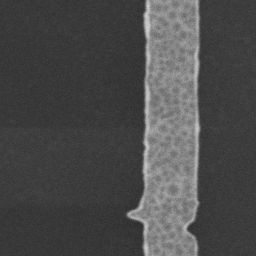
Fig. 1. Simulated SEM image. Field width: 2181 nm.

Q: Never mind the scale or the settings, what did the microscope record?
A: one or a few lines or trenches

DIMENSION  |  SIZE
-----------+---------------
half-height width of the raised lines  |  431 nanometres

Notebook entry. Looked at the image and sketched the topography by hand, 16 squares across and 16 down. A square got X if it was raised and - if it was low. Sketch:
---------XXX----
---------XXX----
---------XXX----
---------XXX----
---------XXX----
---------XXX----
---------XXX----
---------XXX----
---------XXX----
---------XXX----
---------XXX----
---------XXX----
---------XXX----
--------XXXX----
---------XXX----
---------XXX----